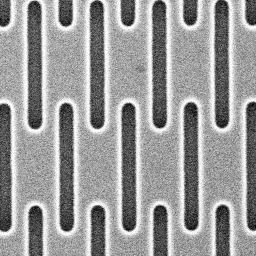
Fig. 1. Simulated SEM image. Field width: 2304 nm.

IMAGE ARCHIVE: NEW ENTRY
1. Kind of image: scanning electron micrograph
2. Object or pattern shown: groups of lines, slits or small figures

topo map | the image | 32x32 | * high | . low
.***.**..**..**..**..**..**..**.
.**..**..**..**..**..**..**..**.
.**..**..**..**..**..**..**..**.
***..******..******..******..***
***..******..******..******..***
***..******..******..******..***
***..******..******..******..***
***..******..******..******..***
***..******..******..******..***
***..******..******..******..***
***..******..******..******..***
***..******..******..******..***
***..******..******..******..***
.**..**..**..**..**..**..**..**.
.**..**..**..**..**..**..**..**.
.***.**..**..**..**..**..**..**.
.******..******..******..******.
.******..******..******..******.
.******..******..******..******.
.******..******..******..******.
.******..******..******..******.
..*****..******..******..******.
..*****..******..******..******.
..*****..******..******..******.
..*****..******..******..******.
..*****..******..******..******.
..**.**..**..**..**..**..**..**.
..*..**..**..**..**..**..**..**.
.**..***.**..**..**..**..**..**.
***..******..******..******..***
***..******..******..******..***
***..******..******..******..***